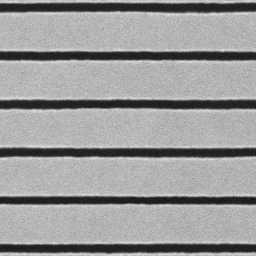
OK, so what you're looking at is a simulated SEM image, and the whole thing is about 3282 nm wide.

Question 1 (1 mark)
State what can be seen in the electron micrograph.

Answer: lines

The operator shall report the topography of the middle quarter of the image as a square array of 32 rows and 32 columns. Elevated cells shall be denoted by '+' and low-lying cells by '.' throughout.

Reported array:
++++++++++++++++++++++++++++++++
++++++++++++++++++++++++++++++++
++++++++++++++++++++++++++++++++
++++++++++++++++++++++++++++++++
++++++++++++++++++++++++++++++++
++++++++++++++++++++++++++++++++
++++++++++++++++++++++++++++++++
++++++++++++++++++++++++++++++++
++++++++++++++++++++++++++++++++
................................
................................
++++++++++++++++++++++++++++++++
++++++++++++++++++++++++++++++++
++++++++++++++++++++++++++++++++
++++++++++++++++++++++++++++++++
++++++++++++++++++++++++++++++++
++++++++++++++++++++++++++++++++
++++++++++++++++++++++++++++++++
++++++++++++++++++++++++++++++++
++++++++++++++++++++++++++++++++
++++++++++++++++++++++++++++++++
................................
................................
++++++++++++++++++++++++++++++++
++++++++++++++++++++++++++++++++
++++++++++++++++++++++++++++++++
++++++++++++++++++++++++++++++++
++++++++++++++++++++++++++++++++
++++++++++++++++++++++++++++++++
++++++++++++++++++++++++++++++++
++++++++++++++++++++++++++++++++
++++++++++++++++++++++++++++++++